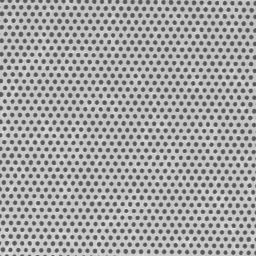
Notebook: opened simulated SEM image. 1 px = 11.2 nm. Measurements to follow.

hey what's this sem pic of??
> a regular array of holes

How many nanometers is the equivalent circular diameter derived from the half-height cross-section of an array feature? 50.7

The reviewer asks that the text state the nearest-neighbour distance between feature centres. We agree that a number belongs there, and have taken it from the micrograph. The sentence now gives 84 nanometres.